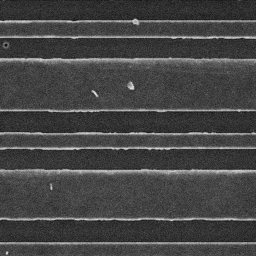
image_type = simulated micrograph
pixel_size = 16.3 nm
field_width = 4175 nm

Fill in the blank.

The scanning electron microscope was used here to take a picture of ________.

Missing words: lines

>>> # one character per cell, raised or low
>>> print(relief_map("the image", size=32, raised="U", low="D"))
DDDDDDDDDDDDDDDDDDDDDDDDDDDDDDDD
DDDDDDDDDDDDDDDDDDDDDDDDDDDDDDDD
DDDDDDDDDDDDDDDDDDDDDDDDDDDDDDDD
UUUUUUUUUUUUUUUUUUUUUUUUUUUUUUUU
UUUUUUUUUUUUUUUUUUUUUUUUUUUUUUUU
DDDDDDDDDDDDDDDDDDDDDDDDDDDDDDDD
DDDDDDDDDDDDDDDDDDDDDDDDDDDDDDDD
UUUUUUUUDDDDDDDDDDDDDDDDDDDDDDDD
UUUUUUUUUUUUUUUUUUUUUUUUUUUUUUUU
UUUUUUUUUUUUUUUUUUUUUUUUUUUUUUUU
UUUUUUUUUUUUUUUUUUUUUUUUUUUUUUUU
UUUUUUUUUUUUUUUUUUUUUUUUUUUUUUUU
UUUUUUUUUUUUUUUUUUUUUUUUUUUUUUUU
UUUUUUUUUUUUUUUUUUUUUUUUUUUUUUUU
DDDDDDDDDDDDDDDDDDDDDDDDDDDDDDDD
DDDDDDDDDDDDDDDDDDDDDDDDDDDDDDDD
DDDDDDDDDDDDDDDDDDDDDDDDDDDDDDDD
UUUUUUUUUUUUUUUUUUUUUUUUUUUUUUUU
UUUUUUUUUUUUUUUUUUUUUUUUUUUUUUUU
DDDDDDDDDDDDDDDDDDDDDDDDDDDDDDDD
DDDDDDDDDDDDDDDDDDDDDDDDDDDDDDDD
UDDDUUUUUUUUUUUUUUUUUUUUUUUUUUUU
UUUUUUUUUUUUUUUUUUUUUUUUUUUUUUUU
UUUUUUUUUUUUUUUUUUUUUUUUUUUUUUUU
UUUUUUUUUUUUUUUUUUUUUUUUUUUUUUUU
UUUUUUUUUUUUUUUUUUUUUUUUUUUUUUUU
UUUUUUUUUUUUUUUUUUUUUUUUUUUUUUUU
DDDDDDDDDDDDDDDDDDDDDUDDDDDDDDDD
DDDDDDDDDDDDDDDDDDDDDDDDDDDDDDDD
DDDDDDDDDDDDDDDDDDDDDDDDDDDDDDDD
UUUUUUUUUUUUUUUUUUUUUUUUUUUUUUUU
UUUUUUUUUUUUUUUUUUUUUUUUUUUUUUUU